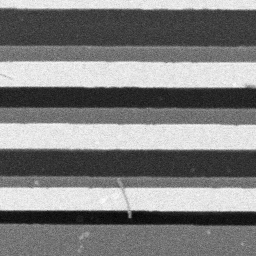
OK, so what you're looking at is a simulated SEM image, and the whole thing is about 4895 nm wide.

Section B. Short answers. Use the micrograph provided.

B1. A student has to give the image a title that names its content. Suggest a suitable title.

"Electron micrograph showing lines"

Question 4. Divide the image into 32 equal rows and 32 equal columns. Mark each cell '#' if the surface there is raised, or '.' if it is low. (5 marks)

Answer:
################################
................................
................................
................................
................................
................................
################################
################################
################################
################################
################################
................................
................................
................................
################################
################################
################################
################################
################################
................................
................................
................................
################################
################################
################################
################################
................#...............
................................
################################
################################
################################
################################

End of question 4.